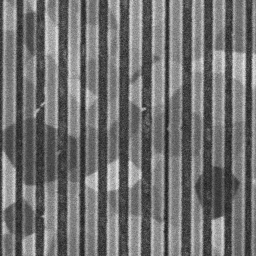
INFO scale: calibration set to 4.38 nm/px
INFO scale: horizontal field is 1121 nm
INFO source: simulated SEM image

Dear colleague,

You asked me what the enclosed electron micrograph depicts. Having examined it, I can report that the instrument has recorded parallel lines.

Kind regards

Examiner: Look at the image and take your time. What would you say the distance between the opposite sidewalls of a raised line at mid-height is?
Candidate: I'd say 0.0476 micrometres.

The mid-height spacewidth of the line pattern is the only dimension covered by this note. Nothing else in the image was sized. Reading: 0.0476 microns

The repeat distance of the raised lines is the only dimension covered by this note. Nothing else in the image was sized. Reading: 91.2 nanometers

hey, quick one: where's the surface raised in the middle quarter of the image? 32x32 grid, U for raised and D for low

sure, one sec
DUUUDDUUDDDUUDDDDUUDDDUUUDDUUDDD
DUUUDDUUDDDUUDDDDUUDDDUUUDDUUDDD
DUUUDDUUDDDUUDDDDUUDDDUUUDDUUDDD
DUUUDDUUDDDUUDDDDUUDDDUUUDDUUDDD
DUUUDDUUDDDUUUDDDUUDDDUUUDDUUDDD
DUUUDDUUDDDUUUDDDUUDDDUUUDDUUDDD
DUUUDDUUDDDUUUDDDUUDDDUUUDDUUDDD
DUUUDDUUDDDUUDDDDUUDDDUUUDDUUDDD
DUUUDDUUDDDUUDDDDUUDDDUUUDDUUDDD
DUUUDDUUDDDUUDDDDUUDDDUUUDDUUDDD
DUUUDDUUDDDUUDDDDUUDDDUUUDDUUDDD
DUUUDDUUDDDUUDDDUUUDDDUUUDDUUDDD
DUUUDDUUDDDUUDDDUUUDDDUUUDDUUDDD
DUUUDDUUDDDUUDDDUUUDDDUUUDDUUDDD
DUUUDDUUDDDUUDDDUUUDDDUUUDDUUDDD
DUUUDDUUDDDUUDDDUUUDDDUUUDUUUDDD
DUUUDDUUDDDUUDDDUUUDDDUUUDUUUDDD
DUUUDDUUDDDUUDDDUUUDDDUUUDDUUDDD
DUUUDDUUDDDUUDDDDUUDDDUUUDDUUDDD
DUUUDDUUDDDUUDDDUUUDDDUUUDDUUDDD
DUUUDDUUDDDUUDDDUUUDDDUUUDDUUDDD
DUUUDDUUDDDUUDDDUUUDDDUUUDDUUDDD
DUUUDDUUDDDUUDDDUUUDDDUUUDDUUDDD
DUUUDDUUDDDUUDDDUUUDDDUUUDDUUDDD
DUUUDDUUDDDUUDDDUUUDDDUUUDDUUDDD
DUUUDDUUDDDUUDDDUUUDDDUUUDDUUDDD
DUUUDDUUDDDUUDDDUUUDDDUUUDUUUDDD
DUUUDDUUDDDUUDDDUUUDDDUUUDUUUDDD
DUUUDDUUDDDUUDDDUUUDDDUUUDUUUDDD
DUUUDDUUDDDUUDDDUUUDDDUUUDUUUDDD
DUUUDDUUDDDUUDDDUUUDDDUUUDUUUDDD
DUUUDDUUDDDUUDDDUUUDDDUUUDUUUDDD